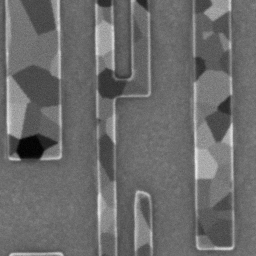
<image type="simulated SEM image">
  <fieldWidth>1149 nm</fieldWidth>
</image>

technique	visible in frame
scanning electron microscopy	wiring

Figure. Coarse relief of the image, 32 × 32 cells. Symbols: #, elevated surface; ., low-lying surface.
.######.....##..###.....#####...
.######.....##..###.....#####...
.######.....##..###.....#####...
.######.....##...##.....#####...
.######.....##...##.....#####...
.######.....##...##.....#####...
.#######....##...##.....#####...
.#######....##...##.....#####...
.#######....##...##.....#####...
.#######....##..###.....#####...
.#######....#######.....#####...
.#######....#######.....#####...
.#######....###.........#####...
.#######....##..........#####...
.#######....##..........#####...
.#######....##..........#####...
.#######....##..........#####...
.#######....##..........#####...
.#######....##..........#####...
.#######....##..........#####...
............##..........#####...
............##...........####...
............##...........####...
............##...........####...
............##...##......####...
............###..##......####...
............###..##......####...
............###..##......####...
............###..##......####...
............###..##......####...
............###..##......####...
............###..##.............